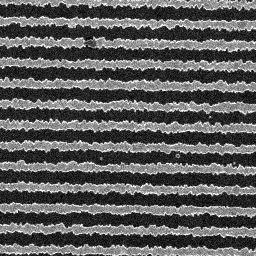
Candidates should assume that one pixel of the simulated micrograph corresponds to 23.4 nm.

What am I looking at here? parallel lines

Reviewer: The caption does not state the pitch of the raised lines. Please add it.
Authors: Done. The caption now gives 484 nm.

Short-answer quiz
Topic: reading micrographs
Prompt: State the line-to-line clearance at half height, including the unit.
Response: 316 nanometers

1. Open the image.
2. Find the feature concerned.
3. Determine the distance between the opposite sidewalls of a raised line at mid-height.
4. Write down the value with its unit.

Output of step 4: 170 nanometers